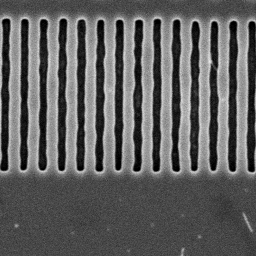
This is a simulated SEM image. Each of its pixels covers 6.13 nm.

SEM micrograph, groups of lines, slits or small figures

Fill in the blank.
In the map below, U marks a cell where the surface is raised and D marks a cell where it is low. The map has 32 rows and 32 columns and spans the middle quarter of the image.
DUUDDDUUDDUUUDDUUDDUUUDDUUUDDUUD
DUUDDUUUDDUUUDDUUDDDUUDDUUUDDUUD
DUUDDUUUDDUUUDDUUDDDUUDDUUUDDUUD
DUUDDUUUDDUUUDDUUDDUUUDDUUUDDUUU
DUUDDUUUDDUUUDDUUUDUUUDDDUUDDUUU
DUUDDUUUDDUUUDDUUUDDUUDDUUUDDUUU
UUUDDUUUDDUUUDDUUDDDUUDDUUUDDUUD
UUUDDUUUDDUUDDDUUDDDUUDDUUUDDUUD
DUUDDUUUDDUUDDDUUDDDUUDDUUUDDUUD
DUUDDUUUDDUUDDDUUDDDUUDDUUUDDUUD
DUUDDUUUDDUUDDDUUDDDUUDDUUUDDUUD
DUUDDUUUDDUUDDDUUDDDUUDDUUUDDUUD
DUUDDUUUDDUUUDDUUDDDUUDDUUUDDUUD
DUUDDUUUDDUUUDDUUDDDUUDDUUUDDUUD
DUUDDUUUDDUUUDDUUDDDUUDDUUUDDUUD
DUUDDUUUDDUUDDDUUDDUUUDDUUUDDUUD
DUUDDUUUDDUUDDDUUDDUUUDDUUUDDUUD
DUUDDUUUDDUUDDDUUDDDUUDDUUUDDUUD
DUUDDUUUDDUUUDDUUDDDUUDDUUUDDUUD
DUUDDUUUDDUUUDDUUDDDUUDDUUUDDUUD
UUUDDUUUDDUUUDDUUDDDUUDDUUUDDUUD
UUUDDUUUDDUUUDDUUDDUUUDDUUUDDUUD
DUUDDUUUDDUUUDDUUDDUUUDDUUUDDUUD
DUUDDUUUDDUUUDDUUDDDUUDDUUUDDUUD
UUUDDUUUDDUUUDDUUDDDUUDDUUUDDUUU
UUUDDUUUDDUUUDUUUDDUUUDDUUUDDUUU
UUUDDUUUDDUUUDUUUDDUUUDDUUUDDUUU
UUUUUUUUUUUUUUUUUUUUUUUUUUUUUUUU
UUUUUUUUUUUUUUUUUUUUUUUUUUUUUUUU
UUUUUUUUUUUUUUUUUUUUUUUUUUUUUUUU
UUUUUUUUUUUUUUUUUUUUUUUUUUUUUUUU
UUUUUUUUUUUUUUUUUUUUUUUUUUUUUUUU